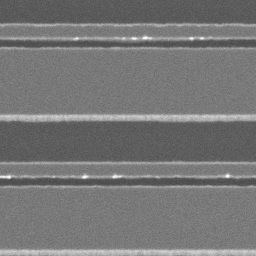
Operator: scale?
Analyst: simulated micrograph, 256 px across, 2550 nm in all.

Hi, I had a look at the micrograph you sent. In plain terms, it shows lines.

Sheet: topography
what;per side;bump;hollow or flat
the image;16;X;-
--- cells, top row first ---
----------------
----------------
XXXXXXXXXXXXXXXX
XXXXXXXXXXXXXXXX
XXXXXXXXXXXXXXXX
XXXXXXXXXXXXXXXX
XXXXXXXXXXXXXXXX
----------------
----------------
----------------
XXXXXXXXXXXXXXXX
XXXXXXXXXXXXXXXX
XXXXXXXXXXXXXXXX
XXXXXXXXXXXXXXXX
XXXXXXXXXXXXXXXX
XXXXXXXXXXXXXXXX